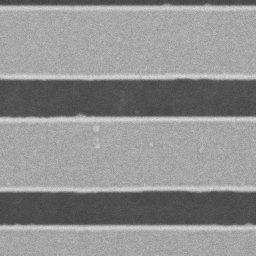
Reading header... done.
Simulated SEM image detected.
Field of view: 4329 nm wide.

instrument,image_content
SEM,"lines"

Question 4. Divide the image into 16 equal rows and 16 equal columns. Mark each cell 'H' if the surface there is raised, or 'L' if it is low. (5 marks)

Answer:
HHHHHHHHHHHHHHHH
HHHHHHHHHHHHHHHH
HHHHHHHHHHHHHHHH
HHHHHHHHHHHHHHHH
HHHHHHHHHHHHHHHH
LLLLLLLLLLLLLLLL
LLLLLLLLLLLLLLLL
HHHHHHHHHHHHHHHH
HHHHHHHHHHHHHHHH
HHHHHHHHHHHHHHHH
HHHHHHHHHHHHHHHH
HHHHHHHHHHHHHHHH
LLLLLLLLLLLLLLLL
LLLLLLLLLLLLLLLL
HHHHHHHHHHHHHHHH
HHHHHHHHHHHHHHHH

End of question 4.